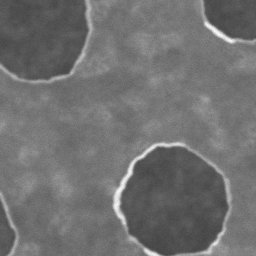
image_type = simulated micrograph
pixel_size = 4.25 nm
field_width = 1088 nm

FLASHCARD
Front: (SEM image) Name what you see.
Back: holes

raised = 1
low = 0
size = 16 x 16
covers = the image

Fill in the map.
0000011111111000
0000001111111000
0000011111111110
0000011111111111
1000111111111111
1111111111111111
1111111111111111
1111111111111111
1111111111111111
1111111110001111
1111111100000111
1111111100000011
1111111100000011
1111111100000011
0111111100000011
0111111110000111